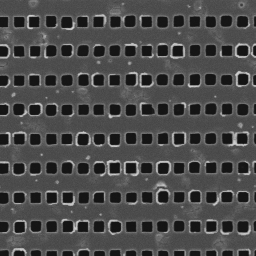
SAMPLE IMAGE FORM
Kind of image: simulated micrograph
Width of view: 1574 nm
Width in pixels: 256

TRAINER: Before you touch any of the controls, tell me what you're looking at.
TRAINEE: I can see a regular array of holes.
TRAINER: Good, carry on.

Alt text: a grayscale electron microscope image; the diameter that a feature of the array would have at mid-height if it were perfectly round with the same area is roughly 72.4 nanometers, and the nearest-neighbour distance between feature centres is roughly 96.6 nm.